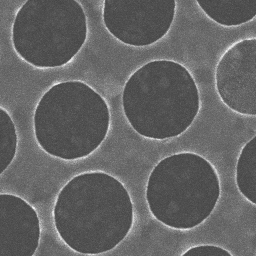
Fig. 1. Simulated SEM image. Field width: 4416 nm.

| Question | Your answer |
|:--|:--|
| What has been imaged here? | holes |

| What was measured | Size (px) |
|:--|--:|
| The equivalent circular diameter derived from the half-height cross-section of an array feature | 76.6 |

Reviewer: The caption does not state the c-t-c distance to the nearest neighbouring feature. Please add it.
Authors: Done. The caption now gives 1590 nm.